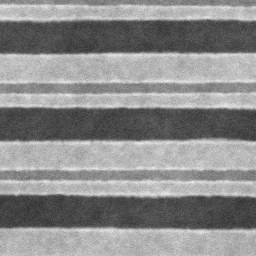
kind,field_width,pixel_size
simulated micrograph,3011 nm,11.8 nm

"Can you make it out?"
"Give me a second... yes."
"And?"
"lines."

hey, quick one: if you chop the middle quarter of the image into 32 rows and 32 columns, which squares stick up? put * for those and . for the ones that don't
********************************
********************************
********************************
********************************
********************************
********************************
********************************
********************************
********************************
********************************
********************************
................................
................................
................................
................................
................................
................................
................................
................................
......****....***...***..****.**
********************************
********************************
********************************
********************************
********************************
********************************
********************************
********************************
********************************
********************************
********************************
********************************